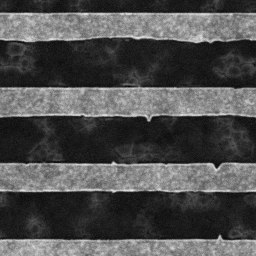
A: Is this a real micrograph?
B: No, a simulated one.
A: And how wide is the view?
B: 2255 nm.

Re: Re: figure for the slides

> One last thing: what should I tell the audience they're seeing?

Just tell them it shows one or a few lines or trenches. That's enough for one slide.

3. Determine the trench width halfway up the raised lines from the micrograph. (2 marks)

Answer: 427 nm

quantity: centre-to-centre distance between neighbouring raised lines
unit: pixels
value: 75.4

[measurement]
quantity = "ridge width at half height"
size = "0.241 µm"